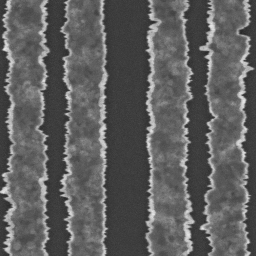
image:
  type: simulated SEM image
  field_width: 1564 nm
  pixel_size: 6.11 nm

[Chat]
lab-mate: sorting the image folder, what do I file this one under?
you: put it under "one or a few lines or trenches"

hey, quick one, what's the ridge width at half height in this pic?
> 225 nanometres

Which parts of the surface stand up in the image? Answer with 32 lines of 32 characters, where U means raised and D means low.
DUUUUUDDUUUUUDDDDDDUUUUDDDUUUUUD
DUUUUUDDUUUUUDDDDDDUUUUDDDUUUUUD
DUUUUUDDUUUUUDDDDDDUUUUDDDUUUUUD
DUUUUUDDUUUUUDDDDDDUUUUDDDUUUUDD
DUUUUDDDUUUUUDDDDDDUUUUDDDUUUUUD
DUUUUUDDUUUUUDDDDDDUUUUDDDUUUUUD
DUUUUUDDDUUUUDDDDDDUUUUDDDUUUUUD
DUUUUDDDUUUUUDDDDDDUUUUDDDUUUUUD
DUUUUUDDUUUUUDDDDDDUUUUUDDUUUUUD
DUUUUUDDUUUUUDDDDDDUUUUUDDUUUUUD
DUUUUUDDUUUUUDDDDDDUUUUUDDUUUUDD
DUUUUDDDDUUUUDDDDDDUUUUUDDUUUUDD
DUUUUDDDUUUUUDDDDDUUUUUUDDUUUUUD
DUUUUDDDDUUUUDDDDDDUUUUDDDUUUUDD
DUUUUDDDDUUUUDDDDDDUUUUDDDDUUUUD
DUUUUDDDUUUUUDDDDDDUUUUDDDUUUUDD
DUUUUDDDUUUUUDDDDDDUUUUDDDUUUUUD
DUUUUUDDUUUUUDDDDDUUUUUDDDUUUUDD
DUUUUUDDUUUUUDDDDDDUUUUDDDUUUUDD
DUUUUUDDUUUUUDDDDDDUUUUDDDUUUUDD
DUUUUUDDUUUUUDDDDDDUUUUDDDUUUUUD
DUUUUUDDUUUUUDDDDDDUUUUDDDDUUUUD
DUUUUUDDUUUUUDDDDDDUUUUDDDUUUUUD
DUUUUUDDUUUUUDDDDDDUUUUDDDUUUUUD
DUUUUUDDUUUUUDDDDDDUUUUDDDUUUUUD
DUUUUUDDUUUUUDDDDDDUUUUUDDUUUUUD
DUUUUUDDDUUUUDDDDDDUUUUUDDUUUUUD
DUUUUUDDDUUUUDDDDDDUUUUUDDUUUUUD
DUUUUUDDDUUUUDDDDDDUUUUUDUUUUUUD
DUUUUUDDDUUUUDDDDDUUUUUUDDUUUUUD
DUUUUUDDDUUUUDDDDDDUUUUUDDUUUUUD
DUUUUUDDDUUUUDDDDDDUUUUUDDUUUUUD